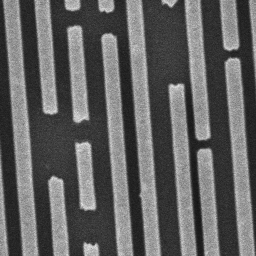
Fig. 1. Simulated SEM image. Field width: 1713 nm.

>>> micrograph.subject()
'parallel lines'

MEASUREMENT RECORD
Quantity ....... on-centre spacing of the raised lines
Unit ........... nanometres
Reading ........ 207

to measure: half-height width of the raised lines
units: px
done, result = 15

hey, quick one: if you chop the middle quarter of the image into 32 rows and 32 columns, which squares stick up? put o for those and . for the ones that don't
..ooo.....oooo...ooo............
..ooo.....oooo...ooo............
..ooo.....oooo...oooo...........
..ooo.....oooo...oooo...........
..ooo.....oooo...oooo...........
..ooo.....oooo...oooo......ooo..
..oooo....oooo...oooo.....oooo..
..oooo....oooo...oooo.....oooo..
..oooo.....ooo...oooo......ooo..
..oooo.....ooo....ooo......ooo..
..oooo.....ooo....ooo......ooo..
..oooo.....ooo....ooo......ooo..
..oooo.....ooo....ooo......ooo..
...ooo.....oooo...ooo......ooo..
...........oooo...ooo......oooo.
...........oooo...oooo.....oooo.
...........oooo...oooo.....oooo.
...........oooo...oooo.....oooo.
...........oooo...oooo.....oooo.
...........oooo...oooo.....oooo.
...oooo....oooo...oooo.....oooo.
...oooo.....ooo...oooo......ooo.
...oooo.....ooo....ooo......ooo.
...oooo.....ooo....ooo......ooo.
...oooo.....ooo....ooo......ooo.
...oooo.....ooo....ooo......ooo.
....ooo.....oooo...ooo......ooo.
....ooo.....oooo...ooo......oooo
....ooo.....oooo...oooo.....oooo
....ooo.....oooo...oooo.....oooo
....ooo.....oooo...oooo.....oooo
....ooo.....oooo...oooo.....oooo